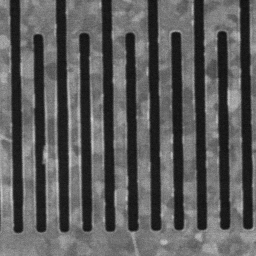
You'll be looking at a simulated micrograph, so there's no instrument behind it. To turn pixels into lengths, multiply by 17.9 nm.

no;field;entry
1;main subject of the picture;groups of lines, slits or small figures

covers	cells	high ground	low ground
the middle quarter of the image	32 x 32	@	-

-@@@---@@@---@@---@@@---@@@---@@
-@@@---@@@---@@---@@@---@@@---@@
-@@@---@@@---@@---@@@---@@@---@@
-@@@---@@@---@@---@@@---@@@---@@
-@@@---@@----@@---@@@---@@@---@@
-@@@---@@----@@---@@@---@@@---@@
-@@@---@@@---@@---@@@---@@@---@@
-@@@---@@@---@@---@@@---@@@---@@
-@@@---@@@---@@---@@@---@@@---@@
-@@@---@@@---@@---@@@---@@@---@@
-@@@---@@@---@@---@@@---@@@---@@
-@@@---@@@---@@---@@@---@@@---@@
-@@@---@@@---@@---@@@---@@@---@@
--@@---@@@---@@---@@@---@@@---@@
--@@---@@@---@@---@@@---@@@---@@
--@@---@@@---@@---@@@---@@@---@@
--@@---@@@---@@---@@@---@@@---@@
--@@---@@@---@@---@@@---@@@---@@
--@@---@@@---@@---@@@---@@@---@@
--@@---@@@---@@---@@@---@@@---@@
--@@---@@@---@@---@@@---@@@---@@
--@@---@@@---@@----@@---@@@---@@
--@@---@@@---@@----@@---@@@---@@
--@@---@@@---@@----@@---@@@---@@
--@@---@@@---@@----@@---@@@---@@
--@@---@@@---@@@---@@---@@@---@@
--@@---@@@---@@@---@@---@@@---@@
--@@---@@@---@@@---@@---@@@---@@
--@@---@@@---@@@---@@---@@@---@@
--@@---@@@---@@@---@@---@@@---@@
--@@---@@@---@@@---@@---@@@---@@
--@@---@@@---@@@---@@---@@@---@@